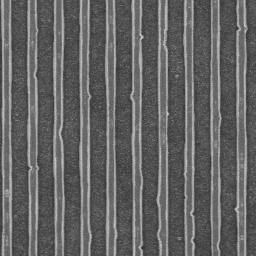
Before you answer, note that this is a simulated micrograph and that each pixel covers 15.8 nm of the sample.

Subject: parallel lines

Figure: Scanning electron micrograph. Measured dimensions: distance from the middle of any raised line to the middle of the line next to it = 412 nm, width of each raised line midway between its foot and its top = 126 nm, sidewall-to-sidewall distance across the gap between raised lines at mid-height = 18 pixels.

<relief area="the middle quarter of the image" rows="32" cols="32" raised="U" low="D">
DDDDUUDDDDDUUDDDDUUDDDDDUUDDDDDU
DDDDUUDDDDDUUDDDDUUDDDDDUUDDDDDU
DDDDUUDDDDDUUDDDDUUDDDDDUUDDDDDU
DDDDUUDDDDDUUDDDDUUDDDDDUUDDDDDU
DDDDUUDDDDDUUDDDDUUDDDDDUUDDDDDU
DDDDUUDDDDDUUDDDDUUDDDDDUUDDDDDU
DDDDUUDDDDDUUDDDDUUDDDDDUUDDDDDU
DDDDUUDDDDDUUDDDDUUDDDDDUUDDDDDU
DDDDUUDDDDDUUDDDDUUDDDDDUUDDDDDU
DDDDUUDDDDDUUDDDDUUDDDDDUUDDDDDU
DDDDUUDDDDDUUDDDDUUDDDDDUUDDDDDU
DDDDUUDDDDDUUDDDDUUDDDDDUUDDDDDU
DDDDUUDDDDDUUDDDDUUDDDDDUUDDDDDU
DDDDUUDDDDDUUDDDDUUDDDDDUUDDDDDU
DDDDUUDDDDDUUDDDDUUDDDDDUUDDDDDU
DDDDUUDDDDDUDDDDDUUDDDDDUUDDDDDU
DDDDUUDDDDDUDDDDDUUDDDDDUUDDDDDU
DDDDUUDDDDDUDDDDDUUDDDDDUUDDDDDU
DDDDUUDDDDDUDDDDDUUDDDDDUUDDDDDU
DDDDUUDDDDDUDDDDDUUDDDDDUUDDDDDU
DDDDUUDDDDDUDDDDDUUDDDDDUUDDDDUU
DDDDUUDDDDDUUDDDDUUDDDDDUUDDDDUU
DDDDUUDDDDDUUDDDDUUDDDDDUUDDDDUU
DDDDUUDDDDDUUDDDDUUDDDDDUUDDDDUU
DDDDUUDDDDDUUDDDDUUDDDDDUUDDDDUU
DDDDUUDDDDDUUDDDDUUDDDDDUUDDDDUU
DDDDUUDDDDDUUDDDDUUDDDDDUUDDDDUU
DDDDUUDDDDDUUDDDDUUDDDDDUUDDDDUU
DDDDUUDDDDDUUDDDDUUDDDDDUUDDDDUU
DDDDUUDDDDDUUDDDDUUDDDDDUUDDDDUU
DDDDUUDDDDDUUDDDDUUDDDDDUUDDDDUU
DDDDUUDDDDDUUDDDDUUDDDDDUUDDDDUU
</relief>